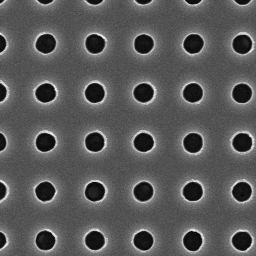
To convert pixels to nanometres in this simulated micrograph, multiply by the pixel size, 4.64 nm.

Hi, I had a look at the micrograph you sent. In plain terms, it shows a regular array of holes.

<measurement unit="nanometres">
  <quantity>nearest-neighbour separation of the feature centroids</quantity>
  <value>227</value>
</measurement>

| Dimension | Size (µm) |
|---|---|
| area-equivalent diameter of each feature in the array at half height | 0.0902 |